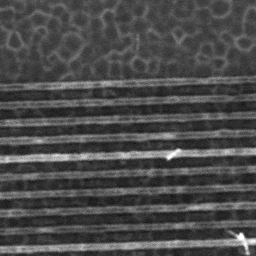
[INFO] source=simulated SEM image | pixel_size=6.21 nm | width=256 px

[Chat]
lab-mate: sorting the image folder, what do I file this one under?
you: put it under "parallel lines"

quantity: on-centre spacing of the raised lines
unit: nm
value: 112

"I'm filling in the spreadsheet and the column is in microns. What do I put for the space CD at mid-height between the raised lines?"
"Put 0.0745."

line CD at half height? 0.0342 microns